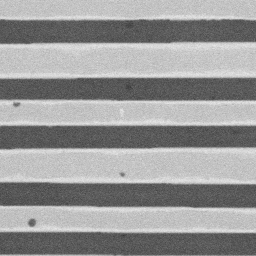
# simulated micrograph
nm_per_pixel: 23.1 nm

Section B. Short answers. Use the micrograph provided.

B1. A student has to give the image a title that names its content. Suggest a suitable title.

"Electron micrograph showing lines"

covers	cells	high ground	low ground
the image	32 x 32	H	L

HHHHHHHHHHHHHHHHHHHHHHHHHHHHHHHH
HHHHHHHHHHHHHHHHHHHHHHHHHHHHHHHH
LLLLLLLLLLLLLLLLLLLLLLLLLLLLLLLL
LLLLLLLLLLLLLLLLLLLLLLLLLLLLLLLL
LLLLLLLLLLLLLLLLLLLLLLLLLLLLLLLL
LLLLLLLLLLLLHHHHHHHHHHHHHHHHHHHH
HHHHHHHHHHHHHHHHHHHHHHHHHHHHHHHH
HHHHHHHHHHHHHHHHHHHHHHHHHHHHHHHH
HHHHHHHHHHHHHHHHHHHHHHHHHHHHHHHH
HHHHHHHHHHHHHHHHHHHHHHHHHHHHHHHH
LLLLLLLLLLLLLLLLLLLLLLLLLLLLLLLL
LLLLLLLLLLLLLLLLLLLLLLLLLLLLLLLL
LLLLLLLLLLLLLLLLLLLLLLLLLLLLLLLL
HHHHHHHHHHHHHHHHHHHHHHHHHHHHHHHH
HHHHHHHHHHHHHHHHHHHHHHHHHHHHHHHH
HHHHHHHHHHHHHHHHHHHHHHHHHHHHHHHH
LLLLLLLLLLLLLLLLLLLLLLLLLLLLLLLL
LLLLLLLLLLLLLLLLLLLLLLLLLLLLLLLL
LLLLLLLLLLLLLLLLLLLLLLLLLLLLLLLL
HHHHHHHHHHHHHHHHHHHHHHHHHHHHHHHH
HHHHHHHHHHHHHHHHHHHHHHHHHHHHHHHH
HHHHHHHHHHHHHHHHHHHHHHHHHHHHHHHH
HHHHHHHHHHHHHHHHHHHHHHHHHHHHHHHH
LLLLLLLLLLLLLLLLLLLLLLLLLLLLLLLL
LLLLLLLLLLLLLLLLLLLLLLLLLLLLLLLL
LLLLLLLLLLLLLLLLLLLLLLLLLLLLLLLL
HHHHHHHHHHHHHHHHHHHHHHHHHHHHHHHH
HHHHHHHHHHHHHHHHHHHHHHHHHHHHHHHH
HHHHHHHHHHHHHHHHHHHHHHHHHHHHHHHH
LLLLLLLLLLLLLLLLLLLLLLLLLLLLLLLL
LLLLLLLLLLLLLLLLLLLLLLLLLLLLLLLL
LLLLLLLLLLLLLLLLLLLLLLLLLLLLLLLL